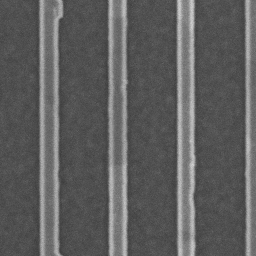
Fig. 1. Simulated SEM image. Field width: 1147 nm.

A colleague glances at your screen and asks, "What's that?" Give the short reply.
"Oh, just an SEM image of one or a few lines or trenches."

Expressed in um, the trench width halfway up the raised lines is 0.249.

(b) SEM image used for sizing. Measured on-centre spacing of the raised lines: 306 nm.